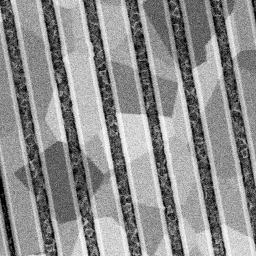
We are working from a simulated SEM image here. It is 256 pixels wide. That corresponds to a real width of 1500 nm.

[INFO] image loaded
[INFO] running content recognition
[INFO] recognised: parallel lines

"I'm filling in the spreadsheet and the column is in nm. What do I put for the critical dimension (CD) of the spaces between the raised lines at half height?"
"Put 98.6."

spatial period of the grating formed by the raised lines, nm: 242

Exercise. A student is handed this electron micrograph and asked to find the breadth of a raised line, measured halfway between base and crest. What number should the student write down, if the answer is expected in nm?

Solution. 143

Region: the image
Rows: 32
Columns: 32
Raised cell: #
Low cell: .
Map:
..###..###..###...###..###..###.
..###..###..####..###..###..###.
..###..####..###..###..###..####
..###...###..###..###..###...###
...###..###..###..###...###..###
#..###..###..###..####..###..###
#..###..###..####..###..###..###
#..###..###...###..###..###..###
#..###...###..###..###..###...##
#..####..###..###..###..####..##
#...###..###..###..####..###..##
##..###..###..###...###..###..##
##..###..###...###..###..###..##
##..###..####..###..###..###..##
##..###...###..###..###..####..#
##...###..###..###..###...###..#
###..###..###..###...###..###..#
###..###..###..####..###..###..#
###..###..###...###..###..###..#
###..###...###..###..###..###...
###..####..###..###..###...###..
####..###..###..###..####..###..
.###..###..###..###...###..###..
.###..###..###...###..###..###..
.###..###..####..###..###..###..
.###..####..###..###..###..####.
.###...###..###..###..###...###.
..###..###..###..###...###..###.
..###..###..###..####..###..###.
#.###..###..####..###..###..###.
#.###..###...###..###..###..###.
#.###...###..###..###..###...###